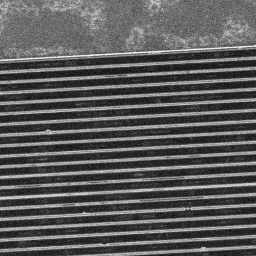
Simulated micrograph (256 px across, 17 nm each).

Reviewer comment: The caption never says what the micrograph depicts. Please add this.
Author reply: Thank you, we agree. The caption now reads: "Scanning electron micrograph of parallel lines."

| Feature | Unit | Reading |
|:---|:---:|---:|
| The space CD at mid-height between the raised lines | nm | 136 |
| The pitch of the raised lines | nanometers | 178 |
